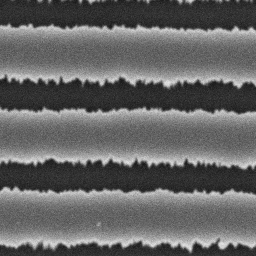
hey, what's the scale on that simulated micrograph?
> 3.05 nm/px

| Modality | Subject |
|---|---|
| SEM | lines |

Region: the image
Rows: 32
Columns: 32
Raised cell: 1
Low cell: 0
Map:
00000000000000000000000000000000
00000000000000000000000000000000
00000000000000000000000000000000
11111110011111110101000000000000
11111111111111111111111111111111
11111111111111111111111111111111
11111111111111111111111111111111
11111111111111111111111111111111
11111111111111111111111111111111
11111111111111111111111111111111
00000000000000000000110000000100
00000000000000000000000000000000
00000000000000000000000000000000
00000000000000000000000000000000
11111111111111111111111111111111
11111111111111111111111111111111
11111111111111111111111111111111
11111111111111111111111111111111
11111111111111111111111111111111
11111111111111111111111111111111
00000000000000000000001000011111
00000000000000000000000000000000
00000000000000000000000000000000
00000000000000000000000000000000
11111111111111111111111111111111
11111111111111111111111111111111
11111111111111111111111111111111
11111111111111111111111111111111
11111111111111111111111111111111
11111111111111111111111111111111
11101010110011010011011101111111
00000000000000000000000000000000